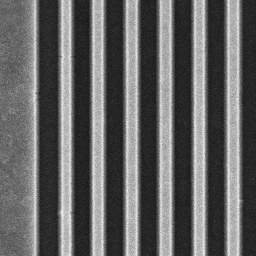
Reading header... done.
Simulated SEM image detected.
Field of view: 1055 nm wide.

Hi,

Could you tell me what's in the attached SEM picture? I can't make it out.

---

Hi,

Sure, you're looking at parallel lines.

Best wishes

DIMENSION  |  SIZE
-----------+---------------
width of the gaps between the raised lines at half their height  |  19.9 pixels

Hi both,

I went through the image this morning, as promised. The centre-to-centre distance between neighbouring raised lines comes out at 138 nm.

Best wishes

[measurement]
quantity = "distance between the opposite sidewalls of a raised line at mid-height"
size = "55.1 nm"